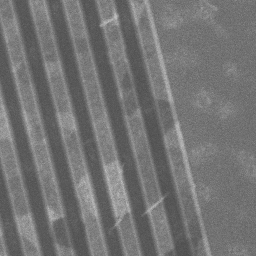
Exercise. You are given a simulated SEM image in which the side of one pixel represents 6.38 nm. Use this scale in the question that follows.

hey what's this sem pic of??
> parallel lines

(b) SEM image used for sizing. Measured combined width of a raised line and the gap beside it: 208 nm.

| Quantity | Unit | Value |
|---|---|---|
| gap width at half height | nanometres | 92.9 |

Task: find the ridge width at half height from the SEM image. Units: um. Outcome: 0.111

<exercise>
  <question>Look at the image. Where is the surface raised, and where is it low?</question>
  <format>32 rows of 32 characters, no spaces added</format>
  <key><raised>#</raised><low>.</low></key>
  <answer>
##..##..##..##..##..............
##..##..##..###..##.............
##..##..###..##..##.............
##..###..##..##..##.............
###..##..##..##..##.............
.##..##..##..###.###............
.##..##..##..###..##............
.##..###..##..##..##............
.###..##..##..##..##............
..##..##..##..###.###...........
..##..##..##..###..##...........
..##..###..##..##..##...........
..###..##..##..##..##...........
#..##..##..##..###.###..........
#..##..##..##..###..##..........
#..##..###..##..##..##..........
#..###..##..##..##..##..........
##..##..##..##..###.###.........
##..##..##..##..###..##.........
##..##..###.###..##..##.........
##..###..##..##..##..##.........
###..##..##..##..###.###........
.##..##..##..##..###..##........
.##..##..###.###..##..##........
.##..###..##..##..##..##........
.###..##..##..##..##..###.......
..##..##..##..##..###..##.......
..##..##..###.###..##..##.......
..##..###.###..##..##..##.......
..###..##..##..##..##..###......
#..##..##..##..##..###..##......
#..##..##..###.###..##..##......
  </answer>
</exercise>